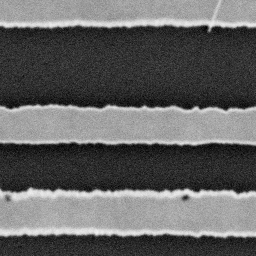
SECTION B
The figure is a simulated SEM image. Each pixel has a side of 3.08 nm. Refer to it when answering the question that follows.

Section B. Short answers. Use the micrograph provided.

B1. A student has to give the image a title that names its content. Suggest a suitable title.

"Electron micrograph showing lines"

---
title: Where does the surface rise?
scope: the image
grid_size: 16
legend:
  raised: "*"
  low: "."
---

****************
*********..*****
................
................
................
................
................
****************
****************
................
................
................
****************
****************
****************
................